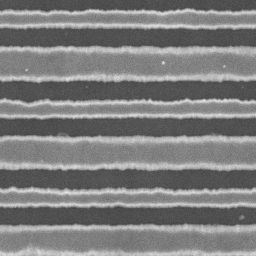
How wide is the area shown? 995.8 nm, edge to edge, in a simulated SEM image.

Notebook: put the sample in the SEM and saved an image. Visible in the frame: lines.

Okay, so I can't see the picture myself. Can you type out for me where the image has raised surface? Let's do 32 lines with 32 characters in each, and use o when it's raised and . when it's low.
................................
ooooo.oooooooooooooo.oooooooo.oo
oooooooooooooooooooooooooooooooo
.......................ooooo.o..
................................
................................
oooooooooooooooooooooooooooooooo
oooooooooooooooooooooooooooooooo
oooooooooooooooooooooooooooooooo
oooooooooooooooooooooooooooooooo
................................
................................
o......................o.oo.oo..
oooooooooooooooooooooooooooooooo
oooooooooooooooooooooooooooooooo
................................
................................
oooooooooooooooooooooooooooooooo
oooooooooooooooooooooooooooooooo
oooooooooooooooooooooooooooooooo
oooooooooooooooooooooooooooooooo
................................
................................
.o..............................
oooooooooooooooooooooooooooooooo
oooooooooooooooooooooooooooooooo
................................
................................
oooooooooooooooooooooooooooooooo
oooooooooooooooooooooooooooooooo
oooooooooooooooooooooooooooooooo
oooooooooooooooooooooooooooooooo